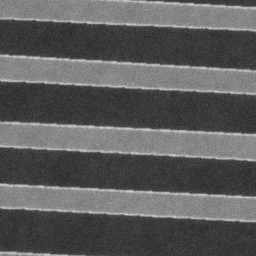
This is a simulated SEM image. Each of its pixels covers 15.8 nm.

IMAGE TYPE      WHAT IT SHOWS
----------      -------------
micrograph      lines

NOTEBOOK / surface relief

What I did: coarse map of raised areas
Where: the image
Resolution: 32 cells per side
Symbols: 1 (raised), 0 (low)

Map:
11111111111111111111111100000000
11111111111111111111111111111111
00001111111111111111111111111111
00000000000000000000000000111111
00000000000000000000000000000000
00000000000000000000000000000000
00000000000000000000000000000000
11111111100000000000000000000000
11111111111111111111111111000000
11111111111111111111111111111111
00000000011111111111111111111111
00000000000000000000000000011111
00000000000000000000000000000000
00000000000000000000000000000000
00000000000000000000000000000000
11111000000000000000000000000000
11111111111111111111111110000000
11111111111111111111111111111111
00001111111111111111111111111111
00000000000000000000000111111111
00000000000000000000000000000000
00000000000000000000000000000000
00000000000000000000000000000000
11111110000000000000000000000000
11111111111111111111111111110000
11111111111111111111111111111111
00000000000111111111111111111111
00000000000000000000000000011111
00000000000000000000000000000000
00000000000000000000000000000000
00000000000000000000000000000000
00000000000000000000000000000000